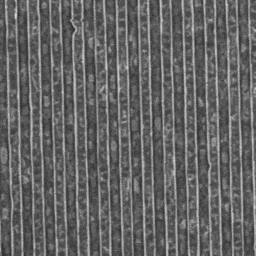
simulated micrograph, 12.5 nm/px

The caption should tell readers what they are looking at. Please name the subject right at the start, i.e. parallel lines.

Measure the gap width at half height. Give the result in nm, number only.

144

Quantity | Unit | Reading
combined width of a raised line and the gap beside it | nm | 276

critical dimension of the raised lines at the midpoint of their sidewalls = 133 nm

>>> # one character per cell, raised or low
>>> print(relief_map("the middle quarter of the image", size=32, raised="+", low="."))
...++...++....++...++...+++...++
...++...+++...++...++...+++...++
...++...+++...++...++....++...++
...++...+++...++...++....++...++
...++...+++...++...++....++...++
...++...+++...++...++....++...++
...++...+++...++...+++...++...++
...++...+++...++...+++...++...++
...++...+++...++...+++...++...++
...++...+++...++...+++...++...++
...++...+++...++...+++...++...++
...++...+++...++...+++...++...++
...++...+++...++...+++...++...++
...++...+++...++...+++...++...++
...++...+++...++....++...++...++
...++...+++...++....++...++...++
...++...+++...++....++...++...++
...++....++...++....++...++...++
...+++...++...++....++...++...++
...++...+++...++....++...++...++
...++....++...++....++...++....+
...+++...++...++....++...++....+
...+++...++...++....++...++....+
...+++...++...++....++...++....+
...+++..+++...+++...++...+++...+
...+++..+++...+++...++...+++...+
...+++...++...+++...++...+++...+
...+++...++...+++...++...+++...+
...+++...++...+++...++...+++...+
...+++...++...+++...++...+++...+
...+++...++...+++...++...+++...+
...+++...++...+++...++...+++...+